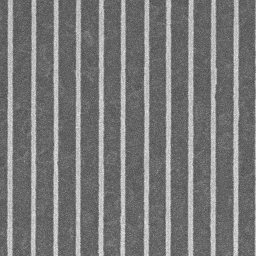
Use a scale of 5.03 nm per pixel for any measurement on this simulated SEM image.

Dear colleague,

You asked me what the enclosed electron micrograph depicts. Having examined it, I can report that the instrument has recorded parallel lines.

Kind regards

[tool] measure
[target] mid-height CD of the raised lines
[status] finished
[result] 0.0189 µm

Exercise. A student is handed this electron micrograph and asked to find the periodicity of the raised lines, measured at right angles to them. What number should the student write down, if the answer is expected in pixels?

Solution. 22.6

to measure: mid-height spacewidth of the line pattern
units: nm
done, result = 95.6